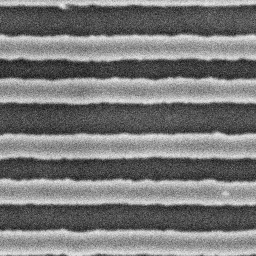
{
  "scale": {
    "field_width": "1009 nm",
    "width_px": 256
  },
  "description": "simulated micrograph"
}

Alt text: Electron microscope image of lines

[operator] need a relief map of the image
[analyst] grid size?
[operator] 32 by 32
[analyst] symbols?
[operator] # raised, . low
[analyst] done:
################################
................................
................................
................................
#...............##....##.......#
################################
################################
.........#####..................
................................
................................
################################
################################
################################
................................
................................
................................
................................
################################
################################
################################
................................
................................
#...##..........................
################################
################################
....................##...#######
................................
................................
................................
################################
################################
################################